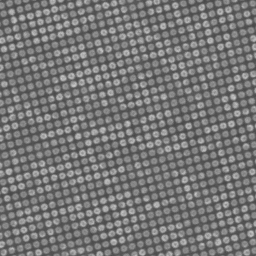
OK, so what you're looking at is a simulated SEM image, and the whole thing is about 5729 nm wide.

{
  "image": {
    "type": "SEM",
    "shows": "a regular array of raised bodies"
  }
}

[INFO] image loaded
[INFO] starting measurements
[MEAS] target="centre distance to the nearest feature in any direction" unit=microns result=0.185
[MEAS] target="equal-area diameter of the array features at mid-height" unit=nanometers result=136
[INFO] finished